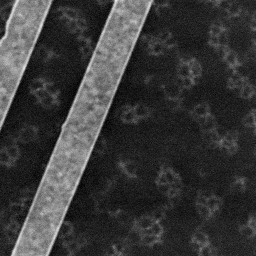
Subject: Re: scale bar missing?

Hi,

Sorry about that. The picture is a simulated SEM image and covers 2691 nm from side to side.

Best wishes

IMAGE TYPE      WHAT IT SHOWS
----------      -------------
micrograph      one or a few lines or trenches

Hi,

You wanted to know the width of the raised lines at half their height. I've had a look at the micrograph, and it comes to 358 nm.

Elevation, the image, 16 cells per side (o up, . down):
.oo....oo.......
.oo....oo.......
oo....oo........
oo....oo........
o....ooo........
o....oo.........
o....oo.........
....oo..........
....oo..........
...ooo..........
...oo...........
...oo...........
..oo............
..oo............
.ooo............
.oo.............